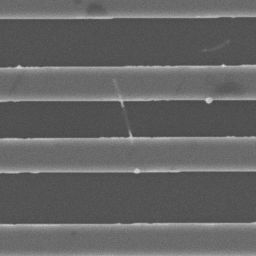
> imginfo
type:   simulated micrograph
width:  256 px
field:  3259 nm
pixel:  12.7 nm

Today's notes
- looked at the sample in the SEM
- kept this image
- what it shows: lines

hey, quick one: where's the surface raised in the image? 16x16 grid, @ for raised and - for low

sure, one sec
@@@@@@@@@@@@@@@@
----------------
----------------
----------------
@@@@@@@@@@@@@@@@
@@@@@@@@@@@@@@@@
----------------
----------------
----------------
@@@@@@@@@@@@@@@@
@@@@@@@@@@@@@@@@
----------------
----------------
----------------
@@@@@@@@@@@@@@@@
@@@@@@@@@@@@@@@@